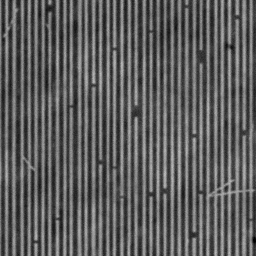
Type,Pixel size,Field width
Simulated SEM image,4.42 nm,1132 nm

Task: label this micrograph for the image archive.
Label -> parallel lines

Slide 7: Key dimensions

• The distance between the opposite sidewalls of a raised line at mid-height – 2.38 pixels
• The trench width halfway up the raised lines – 20.4 nm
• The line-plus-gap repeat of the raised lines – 31.8 nm